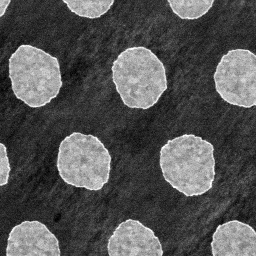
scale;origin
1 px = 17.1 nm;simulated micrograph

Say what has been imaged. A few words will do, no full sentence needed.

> raised bodies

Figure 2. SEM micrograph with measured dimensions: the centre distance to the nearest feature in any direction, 1700 nm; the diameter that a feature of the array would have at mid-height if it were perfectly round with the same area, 958 nm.